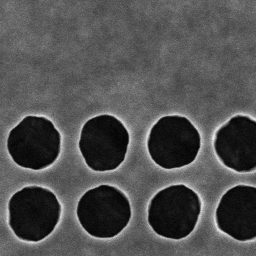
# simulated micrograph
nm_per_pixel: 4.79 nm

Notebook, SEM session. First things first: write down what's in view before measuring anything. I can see holes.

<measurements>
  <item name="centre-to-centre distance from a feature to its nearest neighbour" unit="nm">333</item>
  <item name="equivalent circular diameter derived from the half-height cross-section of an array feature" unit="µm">0.254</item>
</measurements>